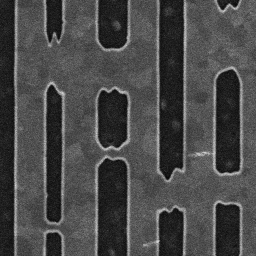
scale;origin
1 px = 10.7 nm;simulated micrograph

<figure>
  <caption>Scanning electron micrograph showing parallel lines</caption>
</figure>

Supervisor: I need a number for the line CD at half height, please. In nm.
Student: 325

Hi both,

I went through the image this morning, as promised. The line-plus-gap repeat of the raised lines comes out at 0.59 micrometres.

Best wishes